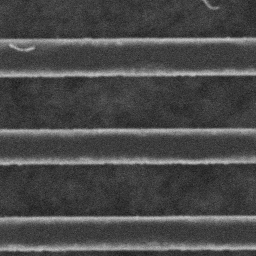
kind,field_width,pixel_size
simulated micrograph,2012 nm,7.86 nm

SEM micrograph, lines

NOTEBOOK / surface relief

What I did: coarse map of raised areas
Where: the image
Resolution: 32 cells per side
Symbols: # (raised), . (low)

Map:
................................
................................
................................
................................
................................
################################
################################
################################
################################
................................
................................
................................
................................
................................
................................
................................
####.##..#######################
################################
################################
################################
................................
................................
................................
................................
................................
................................
................................
################################
################################
################################
################################
................................